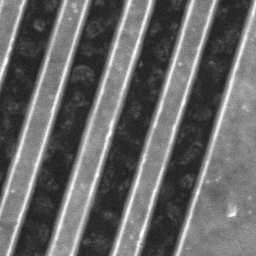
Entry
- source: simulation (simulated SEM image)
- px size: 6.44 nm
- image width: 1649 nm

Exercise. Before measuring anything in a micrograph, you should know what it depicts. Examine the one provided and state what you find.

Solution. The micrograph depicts parallel lines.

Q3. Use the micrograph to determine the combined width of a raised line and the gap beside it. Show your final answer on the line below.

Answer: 0.392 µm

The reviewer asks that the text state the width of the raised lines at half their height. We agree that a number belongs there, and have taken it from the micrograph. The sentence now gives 24 pixels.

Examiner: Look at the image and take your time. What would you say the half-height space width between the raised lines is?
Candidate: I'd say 232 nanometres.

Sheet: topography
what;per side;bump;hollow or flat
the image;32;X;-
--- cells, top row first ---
XXX-----XXX-----XXX-----XXX-----
XXX----XXXX----XXXX----XXXX----X
XX-----XXX-----XXX-----XXX-----X
XX-----XXX-----XXX-----XXX-----X
XX-----XXX-----XXX-----XXX----XX
XX----XXX-----XXX-----XXX-----XX
X-----XXX-----XXX-----XXX-----XX
X-----XXX-----XXX-----XXX----XXX
X----XXXX----XXXX----XXX-----XXX
-----XXX-----XXX-----XXX-----XXX
-----XXX-----XXX-----XXX-----XXX
----XXXX----XXX-----XXX-----XXXX
----XXX-----XXX-----XXX-----XXXX
----XXX-----XXX-----XXX-----XXXX
---XXXX----XXXX----XXXX----XXXXX
---XXX-----XXX-----XXX-----XXXXX
---XXX-----XXX-----XXX-----XXXXX
---XXX----XXXX----XXXX----XXXXXX
--XXXX----XXX-----XXX-----XXXXXX
--XXX-----XXX-----XXX-----XXXXXX
--XXX-----XXX-----XXX-----XXXXXX
-XXXX----XXX-----XXX-----XXXXXXX
-XXX-----XXX-----XXX-----XXXXXXX
-XXX-----XXX-----XXX-----XXXXXXX
XXXX----XXX-----XXX-----XXXXXXXX
XXX-----XXX-----XXX-----XXXXXXXX
XXX-----XXX-----XXX-----XXXXXXXX
XXX----XXXX----XXXX----XXXXXXXXX
XX-----XXX-----XXX-----XXXXXXXXX
XX-----XXX-----XXX-----XXXXXXXXX
XX----XXXX----XXXX----XXXXXXXXXX
X-----XXX-----XXX-----XXXXXXXXXX